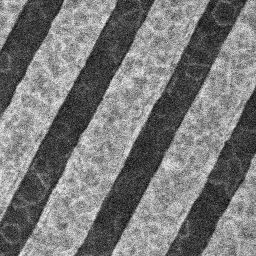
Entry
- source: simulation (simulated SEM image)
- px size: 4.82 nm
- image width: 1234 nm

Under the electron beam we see one or a few lines or trenches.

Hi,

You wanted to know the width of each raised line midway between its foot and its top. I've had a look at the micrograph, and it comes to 47.4 px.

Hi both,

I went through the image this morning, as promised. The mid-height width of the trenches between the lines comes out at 33.5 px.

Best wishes